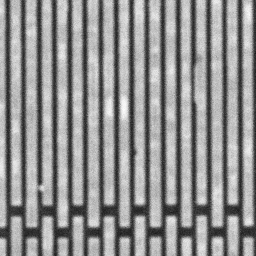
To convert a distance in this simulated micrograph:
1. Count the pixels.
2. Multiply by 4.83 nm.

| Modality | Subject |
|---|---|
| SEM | parallel lines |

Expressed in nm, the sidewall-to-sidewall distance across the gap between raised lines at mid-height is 27.8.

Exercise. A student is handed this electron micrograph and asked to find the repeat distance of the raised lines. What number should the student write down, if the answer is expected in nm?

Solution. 74.7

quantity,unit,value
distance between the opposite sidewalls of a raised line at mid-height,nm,45.9